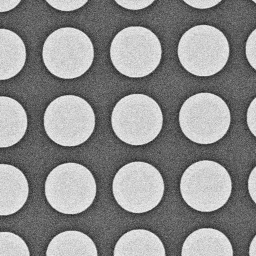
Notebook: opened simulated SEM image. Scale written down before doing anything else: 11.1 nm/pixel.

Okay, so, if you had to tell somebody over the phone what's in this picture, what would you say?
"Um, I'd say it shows an array of small figures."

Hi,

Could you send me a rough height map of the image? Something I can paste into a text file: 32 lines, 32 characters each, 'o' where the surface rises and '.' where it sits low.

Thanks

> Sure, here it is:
oo....oooo.....oooo.....ooo.....
................................
................................
........o.......oo......ooo.....
oo....ooooo...ooooo....ooooo...o
ooo...ooooo...oooooo..oooooo...o
ooo..ooooooo..oooooo..ooooooo..o
ooo..ooooooo..oooooo..oooooo...o
ooo...ooooo....oooo....ooooo....
oo.....ooo......oo..............
................................
................................
oo.....ooo.....oooo....ooooo....
ooo...ooooo...oooooo...ooooo...o
ooo...oooooo..oooooo..ooooooo..o
ooo...oooooo..oooooo...oooooo..o
ooo...oooooo..oooooo...ooooo....
oo.....oooo....oooo.....ooo.....
................................
................................
........oo......ooo.....ooo.....
ooo...ooooo....ooooo...ooooo....
ooo...oooooo..oooooo...oooooo..o
ooo...oooooo..oooooo...oooooo..o
ooo...oooooo..oooooo...oooooo..o
ooo...ooooo....ooooo....oooo....
oo......oo.......o..............
................................
................................
oo.....oooo....ooooo....oooo....
ooo...oooooo...ooooo...oooooo..o
oooo..oooooo..ooooooo..oooooo..o